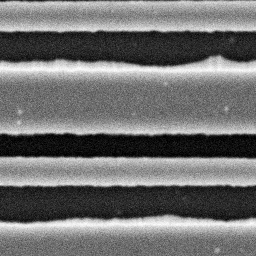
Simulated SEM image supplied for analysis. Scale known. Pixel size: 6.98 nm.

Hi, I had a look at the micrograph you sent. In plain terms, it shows lines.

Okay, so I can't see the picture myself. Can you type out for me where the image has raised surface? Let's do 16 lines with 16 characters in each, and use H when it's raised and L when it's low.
HHHHHHHHHHHHHHHH
HHHHHHHHHHHHHHHH
LLLLLLLLLLLLLLLL
LLLLLLLLLLLLLLLL
HHHHHHHHHHHHHHHH
HHHHHHHHHHHHHHHH
HHHHHHHHHHHHHHHH
HHHHHHHHHHHHHHHH
LLLLLLLLLLLLLLLL
LLLLLLLLLLLLLLLL
HHHHHHHHHHHHHHHH
HHHHHHHHHHHHHHHH
LLLLLLLLLLLLLLLL
LLLLLLLLLLLLLLLL
HHHHHHHHHHHHHHHH
HHHHHHHHHHHHHHHH